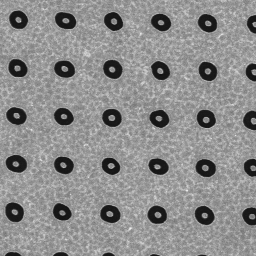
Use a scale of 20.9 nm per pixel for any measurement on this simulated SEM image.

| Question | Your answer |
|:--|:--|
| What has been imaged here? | a regular array of ring-shaped grooves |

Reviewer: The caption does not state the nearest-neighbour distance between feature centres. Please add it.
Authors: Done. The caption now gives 987 nm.